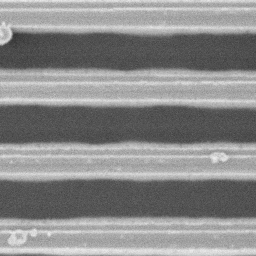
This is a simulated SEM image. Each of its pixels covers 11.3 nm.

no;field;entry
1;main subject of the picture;lines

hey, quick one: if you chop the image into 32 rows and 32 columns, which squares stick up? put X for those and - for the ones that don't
XXXXXXXXXXXXXXXXXXXXXXXXXXXXXXXX
XXXXXXXXXXXXXXXXXXXXXXXXXXXXXXXX
XXXXXXXXXXXXXXXXXXXXXXXXXXXXXXXX
XX--------------X-XXXX-XX-XXXXXX
X-------------------------------
--------------------------------
--------------------------------
--------------------------------
--------------------------------
XXXXXXXXXXXXXXXXXXXXXXXXXXXXXXX-
XXXXXXXXXXXXXXXXXXXXXXXXXXXXXXXX
XXXXXXXXXXXXXXXXXXXXXXXXXXXXXXXX
XXXXXXXXXXXXXXXXXXXXXXXXXXXXXXXX
--------------------------------
--------------------------------
--------------------------------
--------------------------------
--------------------------------
-------XXX-----XXXX------X-X----
XXXXXXXXXXXXXXXXXXXXXXXXXXXXXXXX
XXXXXXXXXXXXXXXXXXXXXXXXXXXXXXXX
XXXXXXXXXXXXXXXXXXXXXXXXXXXXXXXX
--------------------------------
--------------------------------
--------------------------------
--------------------------------
--------------------------------
--------------------------------
XXXXXXXXXXXXXXXXXXXXXXXXXXXXXXXX
XXXXXXXXXXXXXXXXXXXXXXXXXXXXXXXX
XXXXXXXXXXXXXXXXXXXXXXXXXXXXXXXX
--------------------------------